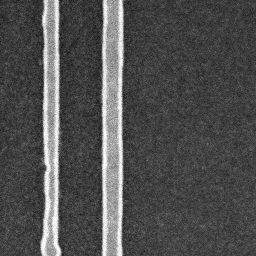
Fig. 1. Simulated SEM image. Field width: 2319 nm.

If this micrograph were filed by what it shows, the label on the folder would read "one or a few lines or trenches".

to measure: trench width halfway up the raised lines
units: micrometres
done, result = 0.435